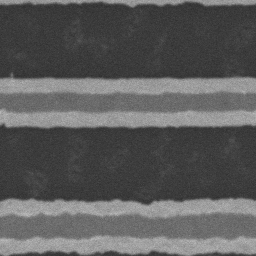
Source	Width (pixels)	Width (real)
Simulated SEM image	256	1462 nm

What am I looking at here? one or a few lines or trenches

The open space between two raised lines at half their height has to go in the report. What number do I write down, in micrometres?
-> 0.503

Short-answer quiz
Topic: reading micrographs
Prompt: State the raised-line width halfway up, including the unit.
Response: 0.206 microns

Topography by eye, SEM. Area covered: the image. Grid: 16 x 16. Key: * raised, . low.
................
................
................
................
................
****************
****************
........*.......
................
................
................
................
................
****************
****************
................